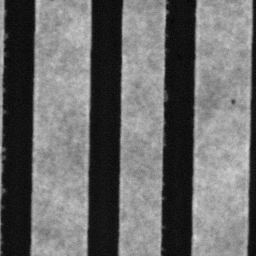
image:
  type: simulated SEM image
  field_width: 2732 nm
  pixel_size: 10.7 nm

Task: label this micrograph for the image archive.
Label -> lines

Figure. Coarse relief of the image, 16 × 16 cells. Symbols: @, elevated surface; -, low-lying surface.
--@@@@--@@--@@@@
--@@@@--@@--@@@@
--@@@@--@@--@@@@
--@@@@--@@--@@@@
--@@@@--@@--@@@@
--@@@@--@@--@@@@
--@@@@--@@--@@@@
--@@@@--@@--@@@@
--@@@@--@@--@@@@
--@@@@--@@--@@@@
--@@@@--@@--@@@@
--@@@@-@@@--@@@@
--@@@@-@@@--@@@@
--@@@@-@@@--@@@@
--@@@--@@@--@@@@
--@@@--@@@--@@@-